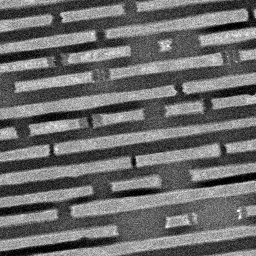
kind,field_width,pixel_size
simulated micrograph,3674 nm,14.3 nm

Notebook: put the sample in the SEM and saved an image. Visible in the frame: parallel lines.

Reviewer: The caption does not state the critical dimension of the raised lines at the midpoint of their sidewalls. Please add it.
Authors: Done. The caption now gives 10.3 pixels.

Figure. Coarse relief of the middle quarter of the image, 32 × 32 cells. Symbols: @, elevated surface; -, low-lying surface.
-------------------@@@@@@@@@@@@@
------------@@@@@@@@@@@@@@@@@---
---@@@@-----@@@@@@-@------------
@@@@@@@-----@-------------------
@@@@@@--------------------------
--------------------------@---@@
-------------------@@@@@@@@@--@@
-----------@@@@@@@@@@@@@@@@@----
--@@@@@@@@@@@@@@@@@@@@@---------
@@@@@@@@@@@@@@@-----------------
@@@@@@@@@@----------------@@@@@@
@@@@----------------------@@@@@@
------------@@@@@@@@-----@@@@---
----------@@@@@@@@@@------------
@@@-------@@@@------------------
@@@@----------------------------
@------------------------@@@@@@@
---------------@@@@@@@@@@@@@@@@@
--------@@@@@@@@@@@@@@@@@@@-----
@@@@@@@@@@@@@@@@@@@@------------
@@@@@@@@@@@@@@------------------
@@@@@@@-----------------------@@
-----------------------@@@@@@@@@
--------------@@@-@@@@@@@@@@@@@@
--------@@@@@@@@@-@@@@@@@@------
-@@@@@@@@@@@@@@@@-@@------------
@@@@@@@@@@@---------------------
@@@@@---------------------------
--------------------@@@@--------
-------------@@@@@@@@@@@--------
------------@@@@@@@@@@@---------
@@@@@@@-----@@@@----------------